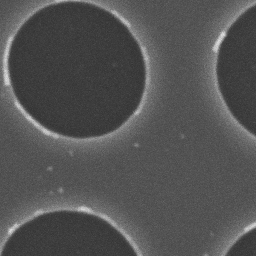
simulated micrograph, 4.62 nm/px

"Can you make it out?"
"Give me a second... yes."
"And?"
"holes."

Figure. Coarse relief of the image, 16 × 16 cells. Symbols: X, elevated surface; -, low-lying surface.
XXX---XXXXXXXXXX
X-------XXXXXX--
X--------XXXXX--
X--------XXXXX--
X--------XXXXX--
X--------XXXXX--
X--------XXXXX--
XX------XXXXXXX-
XXXX--XXXXXXXXXX
XXXXXXXXXXXXXXXX
XXXXXXXXXXXXXXXX
XXXXXXXXXXXXXXXX
XXXXXXXXXXXXXXXX
XX----XXXXXXXXXX
X------XXXXXXXX-
--------XXXXXX--